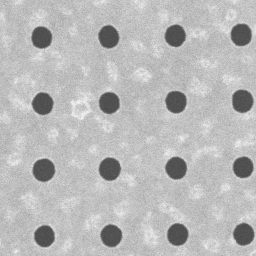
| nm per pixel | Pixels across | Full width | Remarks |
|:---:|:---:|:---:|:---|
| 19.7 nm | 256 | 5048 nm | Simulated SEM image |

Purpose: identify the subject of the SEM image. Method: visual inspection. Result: a regular array of holes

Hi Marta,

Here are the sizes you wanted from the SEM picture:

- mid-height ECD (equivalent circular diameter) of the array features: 0.448 µm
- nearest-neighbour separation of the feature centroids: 1300 nm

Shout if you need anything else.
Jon